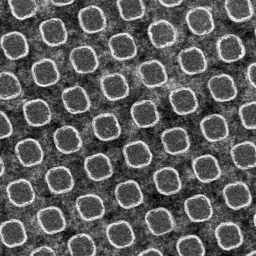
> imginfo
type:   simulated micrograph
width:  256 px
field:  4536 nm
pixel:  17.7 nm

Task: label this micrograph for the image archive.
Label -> a regular array of raised bodies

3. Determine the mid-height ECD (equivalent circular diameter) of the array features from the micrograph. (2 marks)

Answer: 0.468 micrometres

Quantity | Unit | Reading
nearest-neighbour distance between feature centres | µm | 0.719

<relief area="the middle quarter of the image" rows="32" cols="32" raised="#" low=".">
..######...........######....###
...####............######.....##
...................######.......
..........#####.....######......
.........######.....#####.......
.........#######.....##.........
#####.....######............####
#####.....######...........#####
######.....###.............#####
######.............###.....#####
######...........######....#####
.#####...........######.....####
.................######......#..
........#####....######.........
.......######.....#####.........
.......#######.....##...........
###.....######............####..
###.....######...........#####..
####.....###.............######.
####..............#......######.
####............#####....######.
###............######.....####..
...............#######.....#....
......#####....#######..........
.....######.....#####...........
.....#######.....##.............
#.....######............####....
##....######...........#####....
##.....###.............######...
##..............##.....######...
##...........######....######...
#............######.....#####...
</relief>